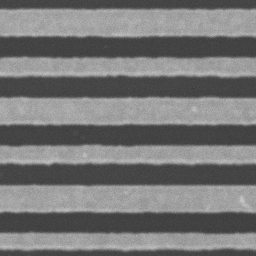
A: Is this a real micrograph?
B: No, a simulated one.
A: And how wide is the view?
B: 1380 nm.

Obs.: lines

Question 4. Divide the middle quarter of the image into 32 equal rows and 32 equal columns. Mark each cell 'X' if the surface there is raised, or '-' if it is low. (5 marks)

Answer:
XXXXXXXXXXXXXXXXXXXXXXXXXXXXXXXX
XXXXXXXXXXXXXXXXXXXXXXXXXXXXXXXX
XXXXXXXXXXXXX--XXXXXXXXXXXXX--XX
--------------------------------
--------------------------------
--------------------------------
--------------------------------
--------------------------------
-----X----------XX--XXXX-X------
XXXXXXXXXXXXXXXXXXXXXXXXXXXXXXXX
XXXXXXXXXXXXXXXXXXXXXXXXXXXXXXXX
XXXXXXXXXXXXXXXXXXXXXXXXXXXXXXXX
XXXXXXXXXXXXXXXXXXXXXXXXXXXXXXXX
XXXXXXXXXXXXXXXXXXXXXXXXXXXXXXXX
XXXXXXXXXXXXXXXXXXXXXXXXXXXXXXXX
--------------------------------
--------------------------------
--------------------------------
--------------------------------
--------------------------------
-----XXXX-----------------------
XXXXXXXXXXXXXXXXXXXXXXXXXXXXXXXX
XXXXXXXXXXXXXXXXXXXXXXXXXXXXXXXX
XXXXXXXXXXXXXXXXXXXXXXXXXXXXXXXX
-XXX----------X------XXXX-----XX
--------------------------------
--------------------------------
--------------------------------
--------------------------------
--------------------------------
--------------------------------
XXXXXXXXXXXXXXXXXXXXXXXXXXXXXXXX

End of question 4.